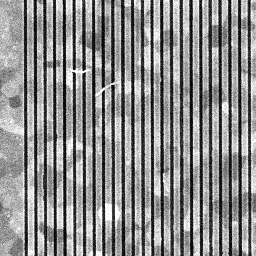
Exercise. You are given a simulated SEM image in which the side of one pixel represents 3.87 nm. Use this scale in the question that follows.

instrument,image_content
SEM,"parallel lines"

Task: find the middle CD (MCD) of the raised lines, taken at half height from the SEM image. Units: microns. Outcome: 0.0232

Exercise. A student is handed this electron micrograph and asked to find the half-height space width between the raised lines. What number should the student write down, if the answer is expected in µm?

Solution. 0.0135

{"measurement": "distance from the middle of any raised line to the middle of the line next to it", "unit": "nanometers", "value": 37.6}